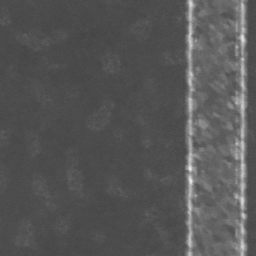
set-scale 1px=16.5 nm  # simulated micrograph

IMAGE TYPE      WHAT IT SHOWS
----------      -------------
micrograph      one or a few lines or trenches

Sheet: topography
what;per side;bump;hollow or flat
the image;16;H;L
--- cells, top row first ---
LLLLLLLLLLLLHHHL
LLLLLLLLLLLLHHHL
LLLLLLLLLLLLHHHL
LLLLLLLLLLLLHHHL
LLLLLLLLLLLLHHHL
LLLLLLLLLLLLHHHL
LLLLLLLLLLLLHHHL
LLLLLLLLLLLLHHHL
LLLLLLLLLLLLHHHL
LLLLLLLLLLLLHHHL
LLLLLLLLLLLLHHHL
LLLLLLLLLLLLHHHL
LLLLLLLLLLLLHHHL
LLLLLLLLLLLLHHHL
LLLLLLLLLLLLHHHL
LLLLLLLLLLLLHHHL